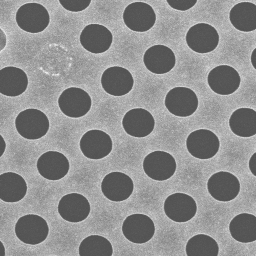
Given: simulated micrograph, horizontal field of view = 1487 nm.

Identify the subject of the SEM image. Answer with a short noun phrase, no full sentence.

a regular array of holes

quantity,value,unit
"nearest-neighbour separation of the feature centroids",272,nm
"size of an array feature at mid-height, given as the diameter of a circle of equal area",182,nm